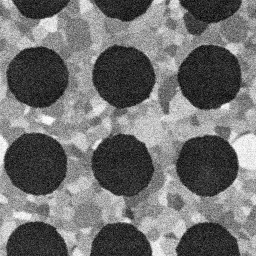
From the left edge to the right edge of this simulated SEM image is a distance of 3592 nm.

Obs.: holes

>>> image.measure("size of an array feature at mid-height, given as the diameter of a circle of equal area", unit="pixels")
63.5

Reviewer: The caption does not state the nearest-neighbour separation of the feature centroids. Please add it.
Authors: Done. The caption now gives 1210 nm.